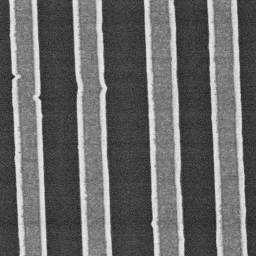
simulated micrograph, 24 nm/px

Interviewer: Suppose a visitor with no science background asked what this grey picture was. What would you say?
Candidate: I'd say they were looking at one or a few lines or trenches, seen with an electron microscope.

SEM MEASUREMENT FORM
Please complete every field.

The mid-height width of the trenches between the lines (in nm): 990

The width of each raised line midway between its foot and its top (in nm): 570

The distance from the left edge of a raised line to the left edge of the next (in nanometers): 1590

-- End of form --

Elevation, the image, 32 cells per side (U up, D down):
DUUUDDDDDUUUDDDDDDUUUDDDDDUUUDDD
DDUUDDDDDUUUDDDDDDUUUUDDDDUUUDDD
DDUUDDDDDUUUDDDDDDUUUUDDDDUUUDDD
DDUUDDDDDDUUDDDDDDDUUUDDDDUUUDDD
DDUUDDDDDDUUUDDDDDDUUUDDDDUUUDDD
DDUUDDDDDDUUDDDDDDDUUUDDDDUUUDDD
DDUUUDDDDDUUUDDDDDDUUUDDDDDUUUDD
DDUUUDDDDDUUUDDDDDDUUUDDDDDUUUDD
DDUUUDDDDDUUUDDDDDDUUUDDDDDUUUDD
DDUUUDDDDDUUUDDDDDDUUUDDDDDUUUDD
DDUUUDDDDDUUUDDDDDDUUUDDDDDUUUDD
DDUUUDDDDDUUUDDDDDDUUUDDDDDUUUDD
DDUUUDDDDDUUUDDDDDDUUUDDDDDUUUDD
DDUUUDDDDDUUUDDDDDDUUUDDDDDUUUDD
DDUUUDDDDDUUUDDDDDDUUUDDDDDUUUDD
DDUUUDDDDDUUUDDDDDDUUUDDDDDUUUDD
DDUUUDDDDDUUUDDDDDDUUUDDDDDUUUDD
DDUUUDDDDDUUUDDDDDDUUUDDDDDUUUDD
DDUUUDDDDDUUUDDDDDDUUUDDDDDUUUDD
DDUUUDDDDDUUUDDDDDDUUUDDDDDUUUDD
DDUUUDDDDDUUUDDDDDDUUUDDDDDUUUDD
DDUUUDDDDDUUUDDDDDDUUUDDDDDUUUDD
DDUUUDDDDDUUUDDDDDDUUUDDDDDUUUDD
DDUUUDDDDDUUUDDDDDDUUUDDDDDUUUDD
DDUUUDDDDDUUUDDDDDDUUUDDDDDUUUDD
DDDUUDDDDDDUUDDDDDDUUUDDDDDUUUDD
DDDUUDDDDDUUUDDDDDDUUUDDDDDUUUDD
DDDUUDDDDDDUUDDDDDDUUUDDDDDUUUDD
DDDUUDDDDDDUUDDDDDDUUUUDDDDUUUDD
DDDUUDDDDDDUUUDDDDDDUUUDDDDUUUUD
DDDUUDDDDDDUUUDDDDDDUUUDDDDUUUUD
DDDUUUDDDDDUUUDDDDDDUUUDDDDDUUUD